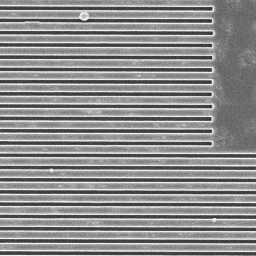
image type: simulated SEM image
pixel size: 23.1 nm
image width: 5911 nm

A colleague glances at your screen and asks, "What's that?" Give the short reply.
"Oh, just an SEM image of parallel lines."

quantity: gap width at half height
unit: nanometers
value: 107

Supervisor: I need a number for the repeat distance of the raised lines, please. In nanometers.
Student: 283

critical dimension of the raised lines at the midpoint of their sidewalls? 190 nanometres